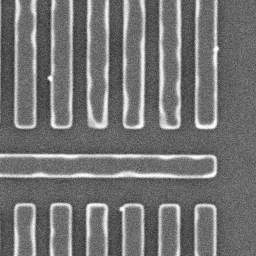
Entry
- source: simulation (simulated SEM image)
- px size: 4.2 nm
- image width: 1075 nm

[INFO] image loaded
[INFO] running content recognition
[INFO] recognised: groups of lines, slits or small figures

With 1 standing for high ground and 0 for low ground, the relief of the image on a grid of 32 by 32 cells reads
00110001100110001100110001100000
00110001100110001100110001100000
00110001100110001100110011100000
00110001100110001100110011100000
00110001100110001100110011100000
00110001100110001100110011100000
00110011100110001100110011100000
00110011100110001100110011100000
00110001100110001100111011100000
00110011100110001100111011100000
00110011100110001100110011100000
00110011100110001100110011100000
00110011100110001100111011100000
00110011100110001100110011100000
00110001100110001100110011100000
00110001100010001100110001100000
00000000000000000000000000000000
00000000000000000000000000000000
00000000000000000000000000000000
11111111111111111111011101100000
11111111111111111111111111100000
11111111111111111111111111100000
00000000000000000000000000000000
00000000000000000000000000000000
00000000000000000000000000000000
00110001000000000000000000000000
00110011100110011100110011100000
00110011100110011100110011100000
00110011100110011100110011100000
00110011100110011100110011100000
00110011100110011100110011100000
00110011100110011100110011100000